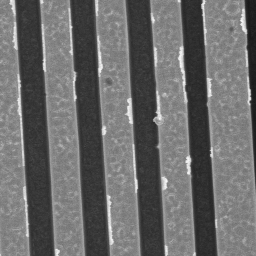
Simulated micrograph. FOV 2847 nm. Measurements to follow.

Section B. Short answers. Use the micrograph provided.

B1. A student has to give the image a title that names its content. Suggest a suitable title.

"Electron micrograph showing parallel lines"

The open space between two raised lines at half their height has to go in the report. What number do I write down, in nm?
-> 268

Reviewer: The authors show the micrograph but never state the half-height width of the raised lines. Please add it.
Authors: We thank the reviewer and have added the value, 0.343 micrometres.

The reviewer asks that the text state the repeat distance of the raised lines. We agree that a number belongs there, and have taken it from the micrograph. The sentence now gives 620 nm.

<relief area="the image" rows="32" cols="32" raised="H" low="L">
HHLLLHHHHLLLHHHHLLLHHHHLLHHHHHHL
HHLLLHHHHLLLHHHHLLLHHHHLLHHHHHHL
HHLLLHHHHLLLHHHHLLLHHHHLLHHHHHHL
HHLLLHHHHLLLHHHHLLLHHHHLLHHHHHHL
HHLLLHHHHLLLHHHHLLLHHHHLLLHHHHHL
HHLLLHHHHLLLHHHHLLLHHHHLLLHHHHHL
HHLLLHHHHLLLHHHHLLLHHHHLLLHHHHHL
HHLLLHHHHLLLHHHHLLLHHHHLLLHHHHHL
HHLLLHHHHLLLHHHHLLLHHHHLLLHHHHHL
HHHLLLHHHLLLHHHHLLLHHHHLLLHHHHHL
HHHLLLHHHLLLHHHHLLLLHHHLLLHHHHHL
HHHLLLHHHLLLHHHHLLLHHHHLLLHHHHHL
HHHLLLHHHHLLLHHHLLLLHHHLLLHHHHHL
HHHLLLHHHLLLLHHHLLLLHHHLLLHHHHHL
HHHLLLHHHHLLLHHHHLLHHHHLLLHHHHHL
HHHLLLHHHHLLLHHHHLLHHHHLLLHHHHHL
HHHLLLHHHHLLLHHHHLLLHHHHLLHHHHHL
HHHLLLHHHHLLLHHHHLLLHHHHLLHHHHHH
HHHLLLHHHHLLLHHHHLLLHHHHLLHHHHHH
HHHLLLHHHHLLLHHHHLLLHHHHLLHHHHHH
HHHLLLHHHHLLLHHHHLLLHHHHLLHHHHHH
HHHLLLHHHHLLLHHHHLLLHHHHLLLHHHHH
HHHLLLHHHHLLLHHHHLLLHHHHLLLHHHHH
HHHLLLHHHHLLLHHHHLLLHHHHLLLHHHHH
HHHLLLHHHHLLLHHHHLLLHHHHLLLHHHHH
HHHLLLLHHHLLLHHHHLLLHHHHLLLHHHHH
HHHLLLLHHHLLLHHHHLLLHHHHLLLHHHHH
HHHLLLLHHHLLLHHHHLLLHHHHLLLHHHHH
HHHHLLLHHHLLLHHHHLLLHHHHLLLHHHHH
HHHHLLLHHHLLLLHHHLLLLHHHLLLHHHHH
HHHHLLLHHHHLLLHHHLLLLHHHLLLHHHHH
HHHHLLLHHHHLLLHHHHLLLHHHLLLHHHHH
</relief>